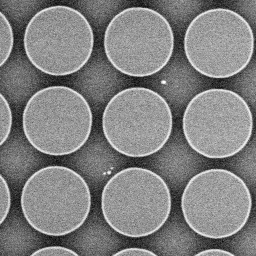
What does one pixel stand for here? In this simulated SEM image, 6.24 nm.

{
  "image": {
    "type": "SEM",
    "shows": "an array of small figures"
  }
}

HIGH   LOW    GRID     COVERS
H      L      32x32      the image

LLLLLLLLLLLLLLLLLLLLLLLLLLLLLLLL
LLLLLHHHHHLLLLLHHHHLLLLLLLHHHLLL
HLLLHHHHHHHLLLHHHHHHHLLLHHHHHHLL
HLLHHHHHHHHLLHHHHHHHHLLLHHHHHHHL
HHLHHHHHHHHHLHHHHHHHHHLHHHHHHHHH
HHLHHHHHHHHHLHHHHHHHHHLHHHHHHHHH
HLLHHHHHHHHLLHHHHHHHHLLHHHHHHHHH
HLLLHHHHHHHLLLHHHHHHHLLLHHHHHHHL
LLLLLHHHHHLLLLLHHHHHLLLLHHHHHHLL
LLLLLLLLLLLLLLLLLLLLLLLLLLHHHLLL
LLLLLLLLLLLLLLLLLLLLLLLLLLLLLLLL
LLLLLHHHHLLLLLLHHHHLLLLLLHHHHLLL
HLLLHHHHHHHLLLHHHHHHLLLLHHHHHHLL
HLLHHHHHHHHLLHHHHHHHHLLHHHHHHHHL
HLLHHHHHHHHLLHHHHHHHHLLHHHHHHHHL
HLLHHHHHHHHLLHHHHHHHHLLHHHHHHHHL
HLLHHHHHHHHLLHHHHHHHHLLHHHHHHHHL
HLLLHHHHHHHLLHHHHHHHHLLHHHHHHHHL
LLLLLHHHHHLLLLHHHHHHLLLLHHHHHHLL
LLLLLLLLLLLLLLLLLLLLLLLLLLHHHLLL
LLLLLLLLLLLLLLLLLLLLLLLLLLLLLLLL
LLLLLHHHHLLLLLLHHHHLLLLLLHHHHLLL
LLLLHHHHHHLLLLHHHHHHLLLLHHHHHHLL
HLLHHHHHHHHLLHHHHHHHHLLHHHHHHHHL
HLLHHHHHHHHLLHHHHHHHHLLHHHHHHHHL
HLLHHHHHHHHLLHHHHHHHHLLHHHHHHHHL
HLLHHHHHHHHLLHHHHHHHHLLHHHHHHHHL
LLLLHHHHHHHLLHHHHHHHHLLHHHHHHHHL
LLLLHHHHHHLLLLHHHHHHLLLLHHHHHHLL
LLLLLLLLLLLLLLLLHLLLLLLLLLHHLLLL
LLLLLLLLLLLLLLLLLLLLLLLLLLLLLLLL
LLLLHHHHHLLLLLLHHHHLLLLLLHHHLLLL